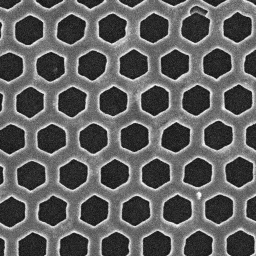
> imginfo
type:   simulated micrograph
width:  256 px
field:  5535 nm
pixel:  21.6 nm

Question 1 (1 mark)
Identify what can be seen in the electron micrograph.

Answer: a regular array of holes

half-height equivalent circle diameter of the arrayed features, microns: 0.629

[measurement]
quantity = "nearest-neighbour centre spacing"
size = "893 nanometers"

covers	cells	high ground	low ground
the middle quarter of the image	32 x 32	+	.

+++........+++.......+++.......+
+++.......++++.......+++.......+
++++......++++......+++++.....++
++++++..++++++++..++++++++...+++
++++++++++++++++++++++++++++++++
++++++++++++++++++++++..++++++++
....+++++++....++++++.....+++++.
......+++.......++++......++++..
......+++.......+++.......++++..
......+++.......+++.......+++...
......+++.......+++.......+++...
.....++++......+++++.....+++++..
....+++++++...+++++++...++++++++
++++++++++++++++++++++++++++++++
++++++++++++++++++++++++++++++++
++++++...+++++++....++++++....++
++++.......+++.......++++.......
.+++.......+++.......++++.......
.+++.......+++.......+++........
.+++.......+++.......+++.......+
++++.......+++.......+++.......+
+++++....+++++++...+++++++...+++
+++++++.++++++++++++++++++++++++
++++++++++++++++++++++++++++++++
+...+++++++...+++++++....+++++++
......++++......++++......++++..
......+++.......+++........+++..
......+++.......+++........+++..
......+++.......+++........+++..
.....++++.......++++......++++..
....++++++....+++++++...++++++++
++++++++++++++++++++++++++++++++